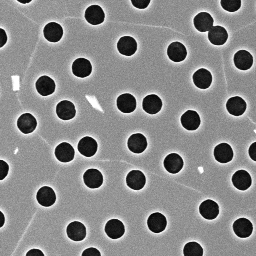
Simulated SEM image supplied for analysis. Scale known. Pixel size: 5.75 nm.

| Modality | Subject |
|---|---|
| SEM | a regular array of holes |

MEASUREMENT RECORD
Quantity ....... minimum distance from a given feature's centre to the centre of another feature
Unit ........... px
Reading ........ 38.2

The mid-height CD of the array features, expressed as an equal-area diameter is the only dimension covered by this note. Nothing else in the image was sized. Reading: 118 nanometers